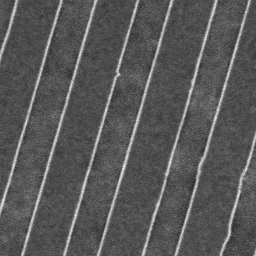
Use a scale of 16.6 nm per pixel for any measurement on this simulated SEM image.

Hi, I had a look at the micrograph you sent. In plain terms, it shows one or a few lines or trenches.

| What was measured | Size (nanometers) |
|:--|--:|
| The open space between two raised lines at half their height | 532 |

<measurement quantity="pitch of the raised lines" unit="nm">1240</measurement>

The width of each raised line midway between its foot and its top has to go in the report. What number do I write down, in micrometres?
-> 0.712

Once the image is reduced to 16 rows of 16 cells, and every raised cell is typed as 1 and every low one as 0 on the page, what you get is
0111001100011001
0110001100111001
1110011100111001
1110011100111001
1110011001110011
1100111001110011
1100111001110011
1100110001100111
1000110011100111
1001110011100111
1001110011101110
1001100111001110
0011100111001110
0011100111001110
0011000110011100
0011001110011100